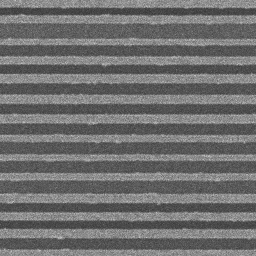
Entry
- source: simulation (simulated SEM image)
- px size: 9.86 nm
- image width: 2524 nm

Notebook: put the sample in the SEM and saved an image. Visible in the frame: parallel lines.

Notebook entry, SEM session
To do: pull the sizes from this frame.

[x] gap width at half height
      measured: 0.116 µm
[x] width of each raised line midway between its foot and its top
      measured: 77.7 nm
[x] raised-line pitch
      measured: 192 nm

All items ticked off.